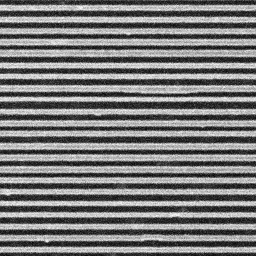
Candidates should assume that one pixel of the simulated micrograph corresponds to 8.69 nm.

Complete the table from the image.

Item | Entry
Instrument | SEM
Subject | parallel lines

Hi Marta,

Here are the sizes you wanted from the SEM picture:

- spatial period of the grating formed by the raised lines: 100 nanometers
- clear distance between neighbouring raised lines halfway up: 7 pixels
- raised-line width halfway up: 4.37 pixels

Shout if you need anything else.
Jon